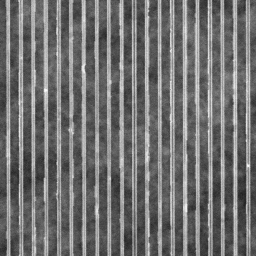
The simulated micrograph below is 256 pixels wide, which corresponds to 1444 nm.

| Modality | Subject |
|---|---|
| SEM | parallel lines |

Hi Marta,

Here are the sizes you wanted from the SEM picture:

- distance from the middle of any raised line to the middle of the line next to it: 71.2 nm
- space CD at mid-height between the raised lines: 0.0557 µm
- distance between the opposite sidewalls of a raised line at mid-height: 16.9 nanometers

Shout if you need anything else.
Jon